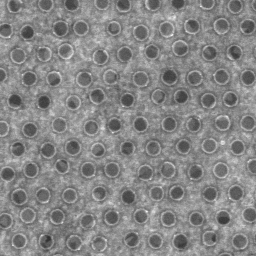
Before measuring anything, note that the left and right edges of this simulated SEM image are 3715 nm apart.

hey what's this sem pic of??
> a regular array of raised bodies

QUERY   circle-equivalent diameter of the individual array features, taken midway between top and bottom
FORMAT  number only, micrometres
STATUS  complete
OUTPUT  0.214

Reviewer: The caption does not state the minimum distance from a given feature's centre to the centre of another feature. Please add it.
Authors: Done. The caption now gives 346 nm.